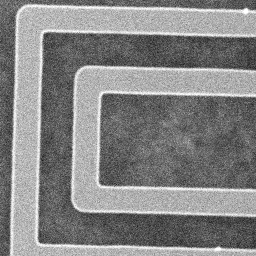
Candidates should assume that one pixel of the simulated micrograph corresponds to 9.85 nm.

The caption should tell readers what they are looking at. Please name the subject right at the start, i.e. groups of lines, slits or small figures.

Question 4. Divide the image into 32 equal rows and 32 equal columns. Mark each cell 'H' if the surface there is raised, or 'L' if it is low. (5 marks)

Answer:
LLLLLLLLLLLLLLLLLLLLLLLLLLLLLLLL
LLHHHHHHHHHHHHHHHHHHHHHHHHHHHHHH
LLHHHHHHHHHHHHHHHHHHHHHHHHHHHHHH
LLHHHHHHHHHHHHHHHHHHHHHHHHHHHHHH
LLHHHLLLLLLLLLLLLLLLLLLLLLLLLLLH
LLHHHLLLLLLLLLLLLLLLLLLLLLLLLLLL
LLHHHLLLLLLLLLLLLLLLLLLLLLLLLLLL
LLHHHLLLLLLLLLLLLLLLLLLLLLLLLLLL
LLHHHLLLLLHHHHHHHHLLLLLLLLLLLLLL
LLHHHLLLLHHHHHHHHHHHHHHHHHHHHHHH
LLHHHLLLLHHHHHHHHHHHHHHHHHHHHHHH
LLHHHLLLLHHHHHHHHHHHHHHHHHHHHHHH
LLHHHLLLLHHHHLLLLLLLLLLLLLLLLLLL
LLHHHLLLLHHHHLLLLLLLLLLLLLLLLLLL
LLHHHLLLLHHHLLLLLLLLLLLLLLLLLLLL
LLHHHLLLLHHHLLLLLLLLLLLLLLLLLLLL
LLHHHLLLLHHHLLLLLLLLLLLLLLLLLLLL
LLHHHLLLLHHHLLLLLLLLLLLLLLLLLLLL
LLHHHLLLLHHHLLLLLLLLLLLLLLLLLLLL
LLHHHLLLLHHHLLLLLLLLLLLLLLLLLLLL
LLHHHLLLLHHHLLLLLLLLLLLLLLLLLLLL
LLHHHLLLLHHHLLLLLLLLLLLLLLLLLLLL
LLHHHLLLLHHHLLLLLLLLLLLLLLLLLLLL
LLHHHLLLLHHHHHHHHHHHLLLLLLLLLLLL
LLHHHLLLLHHHHHHHHHHHHHHHHHHHHHHH
LLHHHLLLLHHHHHHHHHHHHHHHHHHHHHHH
LLHHHLLLLLLLLLLLHHHHHHHHHHHHHHHH
LHHHHLLLLLLLLLLLLLLLLLLLLLLLLLLL
LHHHHLLLLLLLLLLLLLLLLLLLLLLLLLLL
LHHHHLLLLLLLLLLLLLLLLLLLLLLLLLLL
LHHHHLLLLLLLLLLLLLLLLLLLLLLLLLLL
LHHHHHHHHHHHHHHHHHHHHHHHHHHHHHHH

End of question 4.